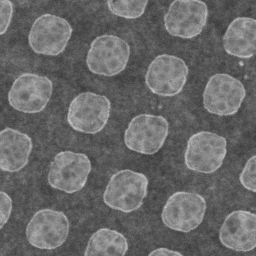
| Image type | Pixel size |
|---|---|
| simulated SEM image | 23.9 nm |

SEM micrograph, a regular array of raised bodies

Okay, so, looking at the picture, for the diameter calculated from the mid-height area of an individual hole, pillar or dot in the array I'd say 0.964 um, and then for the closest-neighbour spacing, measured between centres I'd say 1440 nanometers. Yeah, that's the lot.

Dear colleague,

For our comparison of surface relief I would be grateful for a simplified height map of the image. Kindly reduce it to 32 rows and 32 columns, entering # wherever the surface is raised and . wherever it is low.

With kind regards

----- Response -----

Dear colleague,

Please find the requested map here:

#..............###....###.......
#.............####...#####......
#....###.............#####....##
#...#####............####....###
....#####.............##....####
....####....####............####
.....##....#####.............###
...........#####...####.........
...........####....####.........
...#..............#####....##...
..##.#.............####...####..
.#####..............##....#####.
.#####...####.............####..
..###....#####............####..
.........####.....#.............
.........####...#####...........
##.........#....#####...........
####............####....####....
####............####....####....
###....####............#####....
###....####............#####...#
......#####....##.............##
......#####...####............##
.......###...#####.............#
#............#####....###.......
#.............###....#####......
#....##.............#####....##.
#...####............#####...####
...#####..............##....####
...#####....###.............####
....####...#####............####
...........#####...##...........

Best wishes